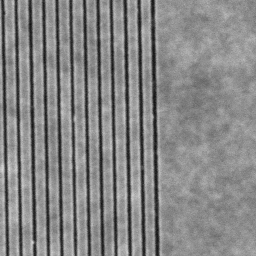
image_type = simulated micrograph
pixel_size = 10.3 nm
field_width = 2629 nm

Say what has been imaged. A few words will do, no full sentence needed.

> parallel lines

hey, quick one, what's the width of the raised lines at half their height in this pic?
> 97.6 nm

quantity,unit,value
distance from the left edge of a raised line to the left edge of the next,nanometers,140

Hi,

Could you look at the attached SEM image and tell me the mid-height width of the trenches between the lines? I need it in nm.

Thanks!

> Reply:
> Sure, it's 39.8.